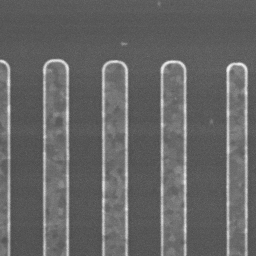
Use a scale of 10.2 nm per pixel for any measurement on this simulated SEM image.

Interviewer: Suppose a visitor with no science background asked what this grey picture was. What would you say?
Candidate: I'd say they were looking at parallel lines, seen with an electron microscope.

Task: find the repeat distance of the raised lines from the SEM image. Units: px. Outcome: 60.4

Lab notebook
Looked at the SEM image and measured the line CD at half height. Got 243 nanometres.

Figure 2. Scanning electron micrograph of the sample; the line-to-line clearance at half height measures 361 nm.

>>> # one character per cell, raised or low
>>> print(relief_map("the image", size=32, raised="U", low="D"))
DDDDDDDDDDDDDDDDDDDDDDDDDDDDDDDD
DDDDDDDDDDDDDDDDDDDDDDDDDDDDDDDD
DDDDDDDDDDDDDDDDDDDDDDDDDDDDDDDD
DDDDDDDDDDDDDDDDDDDDDDDDDDDDDDDD
DDDDDDDDDDDDDDDDDDDDDDDDDDDDDDDD
DDDDDDDDDDDDDDDDDDDDDDDDDDDDDDDD
DDDDDDDDDDDDDDDDDDDDDDDDDDDDDDDD
DDDDDDDDDDDDDDDDDDDDDDDDDDDDDDDD
UDDDDDUUDDDDDUUUDDDDUUUDDDDDDUUD
UDDDDDUUDDDDDUUUDDDDUUUDDDDDDUUD
UDDDDDUUDDDDDUUUDDDDUUUDDDDDDUUD
UDDDDDUUDDDDDUUUDDDDUUUDDDDDDUUD
UDDDDDUUDDDDDUUUDDDDUUUDDDDDDUUD
UDDDDDUUDDDDDUUUDDDDUUUDDDDDDUUD
UDDDDDUUDDDDDUUUDDDDUUUDDDDDDUUD
UDDDDDUUDDDDDUUUDDDDUUUDDDDDDUUD
UDDDDDUUDDDDDUUUDDDDUUUDDDDDDUUD
UDDDDDUUDDDDDUUUDDDDUUUDDDDDDUUD
UDDDDDUUDDDDDUUUDDDDUUUDDDDDDUUD
UDDDDDUUDDDDDUUUDDDDUUUDDDDDDUUD
UDDDDDUUDDDDDUUUDDDDUUUDDDDDDUUD
UDDDDDUUDDDDDUUUDDDDUUUDDDDDUUUD
UDDDDDUUDDDDDUUUDDDDUUUDDDDDUUUD
UDDDDDUUDDDDDUUUDDDDUUUDDDDDUUUD
UDDDDDUUDDDDDUUUDDDDUUUDDDDDUUUD
UDDDDDUUDDDDDUUUDDDDUUUDDDDDDUUD
UDDDDDUUDDDDDUUUDDDDUUUDDDDDDUUD
UDDDDDUUDDDDDUUUDDDDUUUDDDDDDUUD
UDDDDDUUDDDDDUUUDDDDUUUDDDDDDUUD
UDDDDDUUDDDDDUUUDDDDUUUDDDDDDUUD
UDDDDDUUDDDDDUUUDDDDUUUDDDDDDUUD
UDDDDDUUDDDDDUUUDDDDUUUDDDDDDUUD